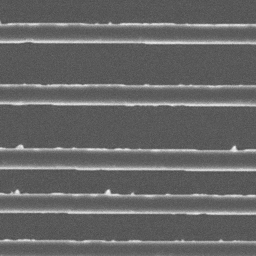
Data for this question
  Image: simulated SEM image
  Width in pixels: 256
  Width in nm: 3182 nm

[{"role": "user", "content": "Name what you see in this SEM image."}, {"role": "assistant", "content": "lines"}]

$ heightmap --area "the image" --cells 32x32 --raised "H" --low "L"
LLLLLLLLLLLLLLLLLLLLLLLLLLLLLLLL
LLLLLLLLLLLLLLLLLLLLLLLLLLLLLLLL
LLLLLLLLLLLLLLLLLLLLLLLLLLLLLLLL
HHHHHHHHHHHHHHHHHHHHHHHHHHHHHHHH
HHHHHHHHHHHHHHHHHHHHHHHHHHHHHHHH
LLLLLLLLLLLLLLLLLLLLLLLLLLLLLLLL
LLLLLLLLLLLLLLLLLLLLLLLLLLLLLLLL
LLLLLLLLLLLLLLLLLLLLLLLLLLLLLLLL
LLLLLLLLLLLLLLLLLLLLLLLLLLLLLLLL
LLLLLLLLLLLLLLLLLLLLLLLLLLLLLLLL
LLLLLLLLLLLLLLLLLLLLLLLLLLLLLLLL
HHHHHHHHHHHHHHHHHHHHHHHHHHHHHHHH
HHHHHHHHHHHHHHHHHHHHHHHHHHHHHHHH
LLLLLLLLLLLLLLLLLLLLLLLLLLLLLLLL
LLLLLLLLLLLLLLLLLLLLLLLLLLLLLLLL
LLLLLLLLLLLLLLLLLLLLLLLLLLLLLLLL
LLLLLLLLLLLLLLLLLLLLLLLLLLLLLLLL
LLLLLLLLLLLLLLLLLLLLLLLLLLLLLLLL
LLLLLLLLLLLLLLLLLLLLLLLLLLLLLLLL
HHHHHHHHHHHHHHHHHHHHHHHHHHHHHHHH
HHHHHHHHHHHHHHHHHHHHHHHHHHHHHHHH
LLLLLLLLLLLLLLLLLLLLLLLLLLLLLLLL
LLLLLLLLLLLLLLLLLLLLLLLLLLLLLLLL
LLLLLLLLLLLLLLLLLLLLLLLLLLLLLLLL
HHHHHHHHHHHHHHHHHHHHHHHHHHHLHHHH
HHHHHHHHHHHHHHHHHHHHHHHHHHHHHHHH
HHHHHHHHHHHHHHHHHHHHHHHHHHHHHHHH
LLLLLLLLLLLLLLLLLLLLLLLLLLLLLLLL
LLLLLLLLLLLLLLLLLLLLLLLLLLLLLLLL
LLLLLLLLLLLLLLLLLLLLLLLLLLLLLLLL
HHHHHHHHHHHHHHHHHHHHHHHHHHHHHHHH
HHHHHHHHHHHHHHHHHHHHHHHHHHHHHHHH